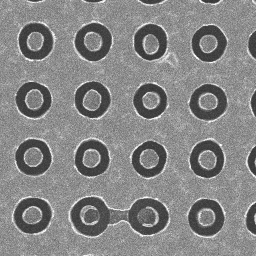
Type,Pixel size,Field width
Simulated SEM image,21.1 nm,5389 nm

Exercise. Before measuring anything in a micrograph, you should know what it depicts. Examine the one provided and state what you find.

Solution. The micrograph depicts a regular array of ring-shaped grooves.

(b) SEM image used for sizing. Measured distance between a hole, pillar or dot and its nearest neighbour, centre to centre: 1200 nm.